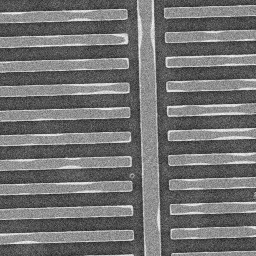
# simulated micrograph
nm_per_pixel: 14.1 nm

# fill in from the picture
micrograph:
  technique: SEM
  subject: groups of lines, slits or small figures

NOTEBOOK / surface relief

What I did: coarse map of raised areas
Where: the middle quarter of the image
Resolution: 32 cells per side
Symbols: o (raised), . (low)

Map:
oooooooooooooooo...oooo...oooooo
oo.................oooo.........
...................oooo.........
...................oooo.........
...................oooo.......oo
oooooooooooooooo...oooo...oooooo
oooooooooooooooo...oooo...oooooo
ooo................oooo.........
...................oooo.........
...................oooo.........
...................oooo.........
oooooooooooooooo...oooo...oooooo
oooooooooooooooo...oooo...oooooo
ooooooooooooo......oooo.........
...................oooo.........
...................oooo.........
...................oooo.........
oooooooooooooooo...oooo...oooooo
oooooooooooooooo...oooo...oooooo
oooooooooooooo......ooo.........
....................ooo.........
....................ooo.........
....................ooo.........
.....oooooooooooo...ooo...oooooo
ooooooooooooooooo...ooo...oooooo
oooooooooooooooo....oooo........
....................oooo........
....................oooo........
....................oooo........
..........ooooooo...oooo..oooooo
ooooooooooooooooo...oooo..oooooo
ooooooooooooooooo...oooo...o....